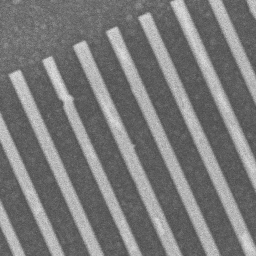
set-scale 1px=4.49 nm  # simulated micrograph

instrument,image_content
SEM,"parallel lines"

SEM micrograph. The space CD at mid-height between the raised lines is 0.111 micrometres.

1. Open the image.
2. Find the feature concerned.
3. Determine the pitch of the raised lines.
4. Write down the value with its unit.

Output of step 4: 159 nanometers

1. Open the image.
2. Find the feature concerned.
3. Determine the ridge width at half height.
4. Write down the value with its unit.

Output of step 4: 46.1 nm